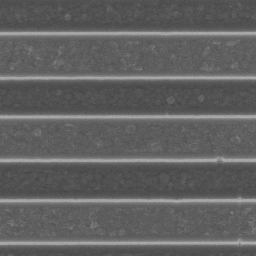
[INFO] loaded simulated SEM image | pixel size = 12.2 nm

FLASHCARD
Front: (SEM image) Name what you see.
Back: one or a few lines or trenches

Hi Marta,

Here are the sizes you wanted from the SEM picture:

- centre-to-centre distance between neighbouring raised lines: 1010 nm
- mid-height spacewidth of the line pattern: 478 nm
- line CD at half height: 0.534 um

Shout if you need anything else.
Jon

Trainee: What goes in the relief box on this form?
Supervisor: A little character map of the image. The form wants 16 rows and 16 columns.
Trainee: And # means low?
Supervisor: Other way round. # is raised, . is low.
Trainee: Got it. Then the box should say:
................
................
################
################
################
................
................
################
################
################
................
................
................
################
################
................